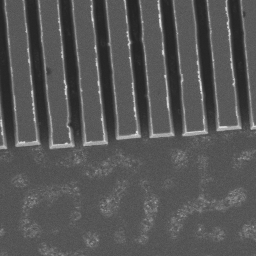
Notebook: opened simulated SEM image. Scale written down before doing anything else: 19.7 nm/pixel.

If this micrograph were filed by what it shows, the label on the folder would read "parallel lines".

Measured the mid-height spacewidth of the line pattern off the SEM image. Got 209 nm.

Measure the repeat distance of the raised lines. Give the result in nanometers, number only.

662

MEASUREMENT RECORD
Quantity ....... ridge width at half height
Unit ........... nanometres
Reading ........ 452